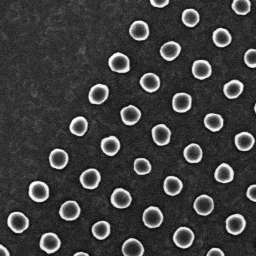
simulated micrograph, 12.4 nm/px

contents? a regular array of raised bodies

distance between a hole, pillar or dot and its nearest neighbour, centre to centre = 455 nm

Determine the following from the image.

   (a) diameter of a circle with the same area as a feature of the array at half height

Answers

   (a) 224 nanometres